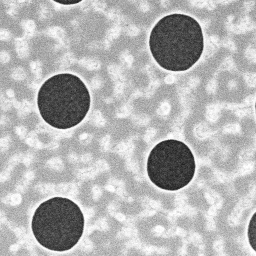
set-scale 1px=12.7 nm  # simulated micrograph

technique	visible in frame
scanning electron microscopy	holes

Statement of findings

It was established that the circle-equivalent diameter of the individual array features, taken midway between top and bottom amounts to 688 nm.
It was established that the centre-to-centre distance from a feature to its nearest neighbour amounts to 1560 nm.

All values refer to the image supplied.